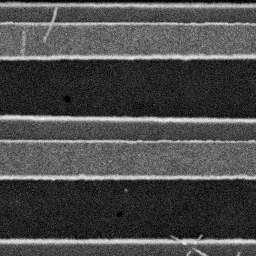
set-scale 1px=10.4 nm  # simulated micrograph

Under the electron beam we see lines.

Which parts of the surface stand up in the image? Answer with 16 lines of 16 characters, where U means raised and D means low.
UUUUUUUUUUUUUUUU
UUUUUUUUUUUUUUUU
UUUUUUUUUUUUUUUU
UUUUUUUUUUUUUUUD
DDDDDDDDDDDDDDDD
DDDDDDDDDDDDDDDD
DDDDDDDDDDDDDDDD
UUUUUUUUDDDDDDDD
UUUUUUUUUUUUUUUU
UUUUUUUUUUUUUUUU
UUUUUUUUUUUUUUUU
DDDDDDDDDDDDDDDD
DDDDDDDDDDDDDDDD
DDDDDDDDDDDDDDDD
DDDDDDDDDDDDDDDD
UUUUUUUUUUUUUUUU